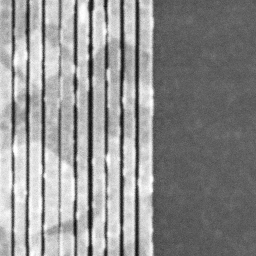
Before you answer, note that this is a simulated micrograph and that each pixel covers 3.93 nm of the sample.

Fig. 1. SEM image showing parallel lines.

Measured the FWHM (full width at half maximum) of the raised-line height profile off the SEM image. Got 0.0451 micrometres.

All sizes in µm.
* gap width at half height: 0.0172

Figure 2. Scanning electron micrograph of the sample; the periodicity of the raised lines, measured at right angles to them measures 15.6 px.